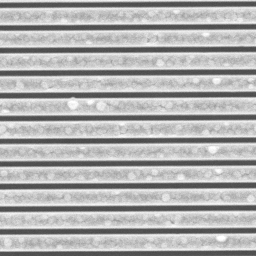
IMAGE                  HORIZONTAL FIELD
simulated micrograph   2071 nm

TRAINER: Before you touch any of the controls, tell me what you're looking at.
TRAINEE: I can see parallel lines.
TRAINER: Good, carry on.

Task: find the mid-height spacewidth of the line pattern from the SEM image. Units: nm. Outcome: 47.5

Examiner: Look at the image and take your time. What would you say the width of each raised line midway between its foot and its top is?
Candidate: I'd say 0.136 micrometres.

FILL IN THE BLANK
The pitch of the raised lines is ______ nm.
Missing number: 183